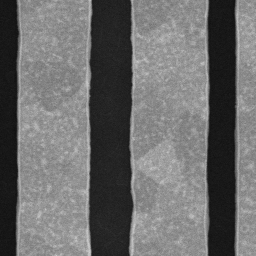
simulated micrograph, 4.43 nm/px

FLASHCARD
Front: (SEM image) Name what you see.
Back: one or a few lines or trenches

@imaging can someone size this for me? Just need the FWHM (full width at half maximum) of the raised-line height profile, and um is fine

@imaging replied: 0.326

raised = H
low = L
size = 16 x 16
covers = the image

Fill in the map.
LHHHHHLLHHHHHLLH
LHHHHHLLHHHHHLLH
LHHHHHLLHHHHHLLH
LHHHHHLLHHHHHLLH
LHHHHHLLHHHHHLLH
LHHHHHLLHHHHHLLH
LHHHHHLLHHHHHLLH
LHHHHHLLHHHHHLLH
LHHHHHLLHHHHHLLH
LHHHHHLLHHHHHLLH
LHHHHHLLHHHHHLLH
LHHHHHLLHHHHHLLH
LHHHHHLLHHHHHLLH
LHHHHHLLHHHHHLLH
LHHHHHLLHHHHHLLH
LHHHHHLLHHHHHLLH